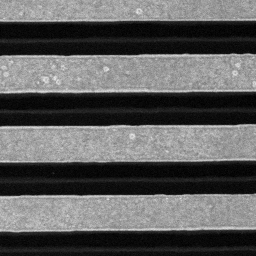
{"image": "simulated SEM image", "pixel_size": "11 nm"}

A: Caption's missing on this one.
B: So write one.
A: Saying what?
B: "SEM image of lines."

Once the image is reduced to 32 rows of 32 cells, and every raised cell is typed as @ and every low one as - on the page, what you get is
@@@@@@@@@@@@@@@@@@@@@@@@@@@@@@@@
@@@@@@@@@@@@@@@@@@@@@@@@@@@@@@@@
@@@@@@@@@@@@@@@@@@@@@@@@@@@@@@@@
--------------------------------
--------------------------------
--------------------------------
--------------------------------
@@@@@@@@@@@@@@@@@@@@@@@@@@@@@@@@
@@@@@@@@@@@@@@@@@@@@@@@@@@@@@@@@
@@@@@@@@@@@@@@@@@@@@@@@@@@@@@@@@
@@@@@@@@@@@@@@@@@@@@@@@@@@@@@@@@
@@@--@---@@---------------------
--------------------------------
--------------------------------
--------------------------------
--------------------------------
@@@@@@@@@@@@@@@@@@@@@@@@@@@@@@@@
@@@@@@@@@@@@@@@@@@@@@@@@@@@@@@@@
@@@@@@@@@@@@@@@@@@@@@@@@@@@@@@@@
@@@@@@@@@@@@@@@@@@@@@@@@@@@@@@@@
--------------------------------
--------------------------------
--------------------------------
--------------------------------
--@@@@@@@@@@@@@@@@@@@@@@@@@@@@@@
@@@@@@@@@@@@@@@@@@@@@@@@@@@@@@@@
@@@@@@@@@@@@@@@@@@@@@@@@@@@@@@@@
@@@@@@@@@@@@@@@@@@@@@@@@@@@@@@@@
@@@@@@@@@@@@@@@@@@@@@@@@@@@@@@@@
--------------------------------
--------------------------------
--------------------------------